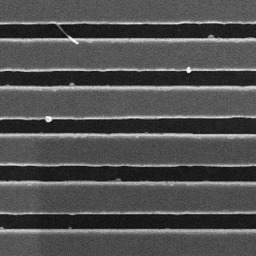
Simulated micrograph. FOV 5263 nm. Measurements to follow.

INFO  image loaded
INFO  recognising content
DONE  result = lines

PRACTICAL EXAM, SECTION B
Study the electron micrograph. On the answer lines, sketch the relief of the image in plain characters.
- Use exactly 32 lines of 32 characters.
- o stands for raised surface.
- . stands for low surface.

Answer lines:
oooooooooooooooooooooooooooooooo
oooooooooooooooooooooooooooooooo
oooooooooooooooooooooooooooooooo
................................
................................
oooooooooooooooooooooooooooooooo
oooooooooooooooooooooooooooooooo
oooooooooooooooooooooooooooooooo
oooooooooooooooooooooooooooooooo
................................
................................
oooooooooooooooooooooooooooooooo
oooooooooooooooooooooooooooooooo
oooooooooooooooooooooooooooooooo
oooooooooooooooooooooooooooooooo
................................
................................
oooooooooooooooooooooooooooooooo
oooooooooooooooooooooooooooooooo
oooooooooooooooooooooooooooooooo
oooooooooooooooooooooooooooooooo
................................
................................
oooooooooooooooooooooooooooooooo
oooooooooooooooooooooooooooooooo
oooooooooooooooooooooooooooooooo
oooooooooooooooooooooooooooooooo
................................
................................
oooooooooooooooooooooooooooooooo
oooooooooooooooooooooooooooooooo
oooooooooooooooooooooooooooooooo